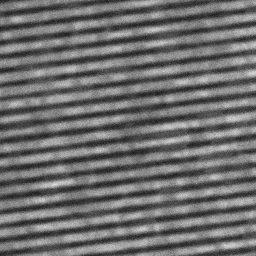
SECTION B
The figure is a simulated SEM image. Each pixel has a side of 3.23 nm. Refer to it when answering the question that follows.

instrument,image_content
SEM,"parallel lines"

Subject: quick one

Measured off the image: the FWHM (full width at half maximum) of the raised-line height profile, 6.07 px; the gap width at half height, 25.2 nm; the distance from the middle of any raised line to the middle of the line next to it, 45.1 nanometres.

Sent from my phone